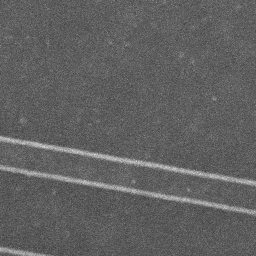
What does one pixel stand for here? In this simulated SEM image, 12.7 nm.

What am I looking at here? one or a few lines or trenches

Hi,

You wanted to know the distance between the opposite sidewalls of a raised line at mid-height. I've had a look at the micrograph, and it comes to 364 nanometres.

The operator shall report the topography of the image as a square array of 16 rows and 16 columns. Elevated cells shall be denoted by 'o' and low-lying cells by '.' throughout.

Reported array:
................
................
................
................
................
................
................
................
................
ooooo...........
ooooooooooo.....
......oooooooooo
...........ooooo
................
................
................